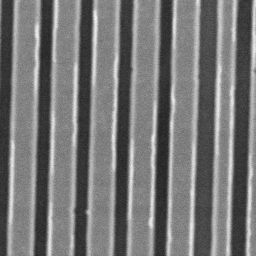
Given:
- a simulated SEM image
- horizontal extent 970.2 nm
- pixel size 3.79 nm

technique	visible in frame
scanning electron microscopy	parallel lines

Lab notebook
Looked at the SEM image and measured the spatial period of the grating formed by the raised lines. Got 152 nm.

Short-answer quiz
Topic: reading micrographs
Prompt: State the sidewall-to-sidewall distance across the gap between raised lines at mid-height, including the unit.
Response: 0.0526 microns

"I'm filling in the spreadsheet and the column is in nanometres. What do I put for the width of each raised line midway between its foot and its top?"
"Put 98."